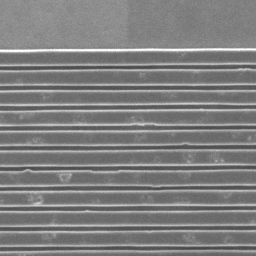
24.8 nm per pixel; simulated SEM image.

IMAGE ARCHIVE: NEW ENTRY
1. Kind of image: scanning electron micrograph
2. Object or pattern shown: parallel lines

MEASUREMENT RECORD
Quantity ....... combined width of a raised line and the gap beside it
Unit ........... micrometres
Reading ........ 0.5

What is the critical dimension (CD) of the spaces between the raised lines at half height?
118 nm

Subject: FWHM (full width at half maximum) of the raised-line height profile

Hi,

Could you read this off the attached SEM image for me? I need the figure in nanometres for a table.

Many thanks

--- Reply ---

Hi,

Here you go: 372